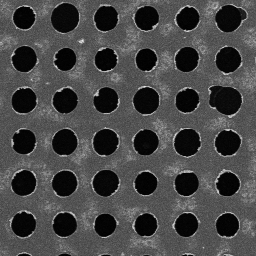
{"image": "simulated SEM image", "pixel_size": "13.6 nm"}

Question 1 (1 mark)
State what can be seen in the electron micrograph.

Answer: a regular array of holes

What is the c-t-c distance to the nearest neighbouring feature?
550 nm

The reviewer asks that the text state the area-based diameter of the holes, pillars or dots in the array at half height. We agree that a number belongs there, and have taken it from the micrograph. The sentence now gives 338 nanometres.